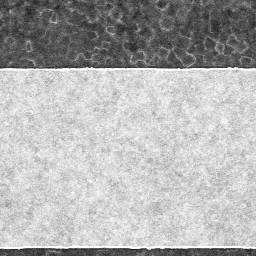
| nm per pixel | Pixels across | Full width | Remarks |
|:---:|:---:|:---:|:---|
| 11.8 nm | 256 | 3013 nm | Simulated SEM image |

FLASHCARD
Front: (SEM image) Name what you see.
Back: one or a few lines or trenches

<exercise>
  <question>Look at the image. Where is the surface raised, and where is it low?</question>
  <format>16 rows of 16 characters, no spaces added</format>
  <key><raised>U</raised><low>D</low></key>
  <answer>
DDDDDDDDDDDDDDDD
DDDDDDDDDDDDDDDD
DDDDDDDDDDDDDDDD
DDDDDDDDDDDDDDDD
UUUUUUUUUUUUUUUU
UUUUUUUUUUUUUUUU
UUUUUUUUUUUUUUUU
UUUUUUUUUUUUUUUU
UUUUUUUUUUUUUUUU
UUUUUUUUUUUUUUUU
UUUUUUUUUUUUUUUU
UUUUUUUUUUUUUUUU
UUUUUUUUUUUUUUUU
UUUUUUUUUUUUUUUU
UUUUUUUUUUUUUUUU
DUDDDDDDDUDDDDDD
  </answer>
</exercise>